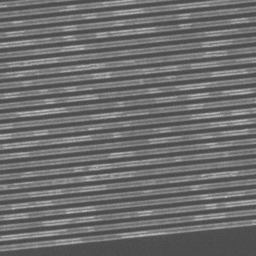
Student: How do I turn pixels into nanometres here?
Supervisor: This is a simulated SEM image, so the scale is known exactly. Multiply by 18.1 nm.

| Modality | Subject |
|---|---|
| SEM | parallel lines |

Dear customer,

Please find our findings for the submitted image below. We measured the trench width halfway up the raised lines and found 92.3 nanometres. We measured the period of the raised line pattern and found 0.183 um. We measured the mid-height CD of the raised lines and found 90 nm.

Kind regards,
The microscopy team